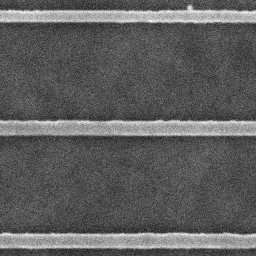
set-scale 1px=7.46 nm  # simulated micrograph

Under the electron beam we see lines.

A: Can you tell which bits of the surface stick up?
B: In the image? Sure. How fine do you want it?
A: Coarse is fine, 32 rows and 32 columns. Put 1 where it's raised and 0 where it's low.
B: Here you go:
00000000000000000000000000000000
11111111111111111110111111111111
11111111111111111111111111111111
00000000000000000000000000000000
00000000000000000000000000000000
00000000000000000000000000000000
00000000000000000000000000000000
00000000000000000000000000000000
00000000000000000000000000000000
00000000000000000000000000000000
00000000000000000000000000000000
00000000000000000000000000000000
00000000000000000000000000000000
00000000000000000000000000000000
00000000000000000000000000000000
11111111111111111111111111111111
11111111111111111111111111111111
00000000000000000000000000000000
00000000000000000000000000000000
00000000000000000000000000000000
00000000000000000000000000000000
00000000000000000000000000000000
00000000000000000000000000000000
00000000000000000000000000000000
00000000000000000000000000000000
00000000000000000000000000000000
00000000000000000000000000000000
00000000000000000000000000000000
00000000000000000000000000000000
11111111111111111111111111111111
11111111111111111111111111111111
00000000000000000000000000000000